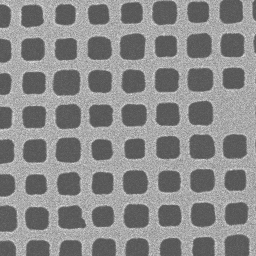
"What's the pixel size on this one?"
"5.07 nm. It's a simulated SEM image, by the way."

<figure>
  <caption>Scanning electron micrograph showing a regular array of holes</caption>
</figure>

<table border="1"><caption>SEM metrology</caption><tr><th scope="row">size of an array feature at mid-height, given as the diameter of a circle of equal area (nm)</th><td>128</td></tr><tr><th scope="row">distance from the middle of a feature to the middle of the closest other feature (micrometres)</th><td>0.168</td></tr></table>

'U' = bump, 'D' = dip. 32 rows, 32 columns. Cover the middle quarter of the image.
UUUUUUUUUUUUUUUUUUUUUUUUUUUUUUUU
UUDUUUUDDDUUUUUUDDDUUUUDDDDDUUUD
DDDDUUDDDDDDUUUDDDDDUUUDDDDDDUUD
DDDDUUDDDDDDUUDDDDDDUUUDDDDDDUUD
DDDDUUDDDDDDUUDDDDDDUUUDDDDDDUUD
DDDDUUDDDDDDUUUDDDDDUUUDDDDDDUUD
DDDDUUDDDDDDUUUDDDDDUUUDDDDDUUUU
DDDUUUUUUUUUUUUUDUUUUUUUUUUUUUUU
UUUUUUUUUUUUUUUUUUUUUUUUUUUUUUUU
UUUUUUUUUUUUUUUUUUUUUUUUUUUUUUUU
DDDDUUUDDDDDUUUDDDDDUUUDDDDDDUUD
DDDDUUDDDDDDUUDDDDDDDUUDDDDDDUUD
DDDDUUDDDDDDUUDDDDDDDUUDDDDDDUUD
DDDDUUDDDDDDUUDDDDDDDUUDDDDDDUUD
DDDDUUDDDDDDUUUDDDDDDUUDDDDDDUUD
DDDDUUUDDDDUUUUUDDDDUUUUDDDDUUUU
UUUUUUUUUUUUUUUUUUUUUUUUUUUUUUUU
UUUUUUUUUUUUUUUUUUUUUUUUUUUUUUUU
DDDUUUUUUUUUUUUUUUUUUUUUDDDDUUUD
DDDDUUUDDDDDUUUDDDDDUUUDDDDDDUUD
DDDDUUUDDDDDUUUDDDDDUUUDDDDDDUUD
DDDDUUUDDDDDUUUDDDDDUUUDDDDDDUUD
DDDDUUUDDDDDUUUDDDDDUUUDDDDDDUUD
DDDDUUUDDDDDUUUUDDDDUUUUDDDDUUUU
DDDUUUUUUUUUUUUUUUUUUUUUUUUUUUUU
UUUUUUUUUUUUUUUUUUUUUUUUUUUUUUUU
UUUUUUUUUUUUUUUUUDDUUUUUUDDUUUUU
DDDUUUUUDDDDUUUDDDDDDUUUDDDDDUUU
DDDDUUUDDDDDDUUDDDDDDUUDDDDDDUUD
DDDDUUUDDDDDDUUDDDDDDUUDDDDDDUUD
DDDDUUUDDDDDUUUDDDDDDUUDDDDDDUUD
DDDDUUUDDDDDUUUDDDDDDUUUDDDDDUUU